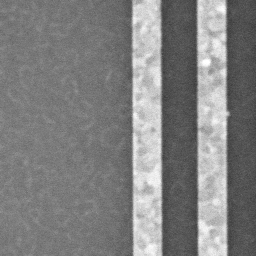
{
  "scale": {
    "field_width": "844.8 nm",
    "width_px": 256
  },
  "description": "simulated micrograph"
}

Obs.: one or a few lines or trenches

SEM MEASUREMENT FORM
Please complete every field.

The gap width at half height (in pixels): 38.6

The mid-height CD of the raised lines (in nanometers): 87.9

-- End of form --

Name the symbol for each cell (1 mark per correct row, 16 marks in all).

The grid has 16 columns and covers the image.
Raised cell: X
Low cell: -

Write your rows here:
--------XX--XX--
--------XX--XX--
--------XX--XX--
--------XX--XX--
--------XX--XX--
--------XX--XX--
--------XX--XX--
--------XX--XX--
--------XX--XX--
--------XX--XX--
--------XX--XX--
--------XX--XX--
--------XX--XX--
--------XX--XX--
--------XX--XX--
--------XX--XX--